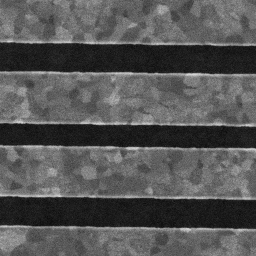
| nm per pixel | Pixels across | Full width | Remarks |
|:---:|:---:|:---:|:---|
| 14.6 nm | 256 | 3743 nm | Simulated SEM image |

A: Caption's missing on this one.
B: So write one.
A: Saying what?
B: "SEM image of lines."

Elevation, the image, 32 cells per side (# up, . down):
################################
################################
################################
################################
################################
..................##############
................................
................................
................................
################################
################################
################################
################################
################################
################################
...........#####################
................................
................................
#############...................
################################
################################
################################
################################
################################
..##############################
................................
................................
................................
##################..............
################################
################################
################################